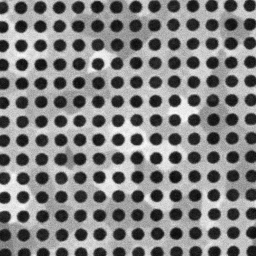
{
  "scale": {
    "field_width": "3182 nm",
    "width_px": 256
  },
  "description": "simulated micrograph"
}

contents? a regular array of holes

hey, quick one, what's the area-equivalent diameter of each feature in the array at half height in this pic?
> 169 nanometers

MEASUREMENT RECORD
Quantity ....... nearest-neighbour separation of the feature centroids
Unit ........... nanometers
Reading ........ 232